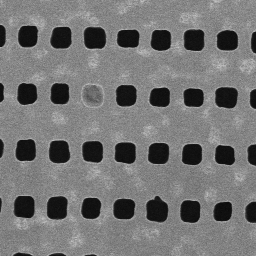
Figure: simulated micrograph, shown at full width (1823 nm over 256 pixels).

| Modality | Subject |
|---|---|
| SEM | a regular array of holes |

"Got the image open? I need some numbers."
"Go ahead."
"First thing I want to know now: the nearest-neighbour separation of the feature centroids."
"0.235 um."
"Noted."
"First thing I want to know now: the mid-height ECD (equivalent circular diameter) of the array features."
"155 nm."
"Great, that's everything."